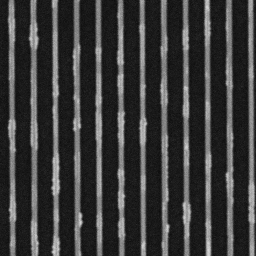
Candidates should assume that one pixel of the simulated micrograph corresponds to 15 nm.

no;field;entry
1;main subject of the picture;parallel lines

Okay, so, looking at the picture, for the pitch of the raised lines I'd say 325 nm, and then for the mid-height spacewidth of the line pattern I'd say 258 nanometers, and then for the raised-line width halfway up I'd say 71.1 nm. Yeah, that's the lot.